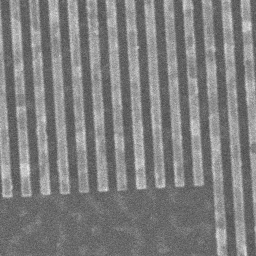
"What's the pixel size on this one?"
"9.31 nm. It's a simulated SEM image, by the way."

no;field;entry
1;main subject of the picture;parallel lines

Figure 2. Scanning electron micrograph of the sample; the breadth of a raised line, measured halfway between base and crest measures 80.1 nanometers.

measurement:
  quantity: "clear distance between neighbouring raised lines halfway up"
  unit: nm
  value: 103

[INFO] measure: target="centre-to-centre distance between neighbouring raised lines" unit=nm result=179